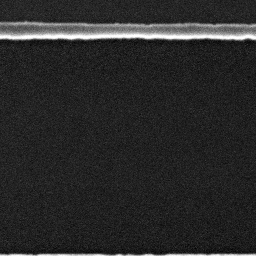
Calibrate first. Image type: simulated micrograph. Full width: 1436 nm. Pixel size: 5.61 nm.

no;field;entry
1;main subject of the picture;lines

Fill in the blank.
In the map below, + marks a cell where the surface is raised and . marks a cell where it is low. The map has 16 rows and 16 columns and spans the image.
++++++++++++++++
++++++++++++++++
................
................
................
................
................
................
................
................
................
................
................
................
................
................